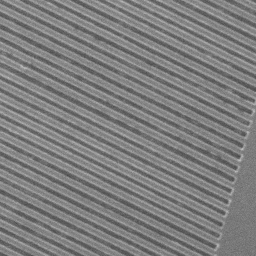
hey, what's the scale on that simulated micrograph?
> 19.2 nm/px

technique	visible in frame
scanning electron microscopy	parallel lines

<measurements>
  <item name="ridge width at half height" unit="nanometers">110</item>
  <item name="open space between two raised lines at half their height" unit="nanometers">108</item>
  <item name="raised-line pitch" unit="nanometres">218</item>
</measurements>